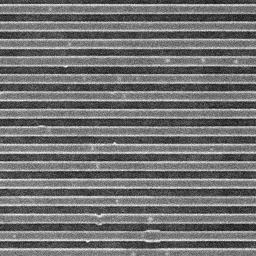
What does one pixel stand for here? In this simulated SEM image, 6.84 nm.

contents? parallel lines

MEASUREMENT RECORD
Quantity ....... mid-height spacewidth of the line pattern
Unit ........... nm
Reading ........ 53.9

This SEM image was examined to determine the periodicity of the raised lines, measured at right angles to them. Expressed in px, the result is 17.4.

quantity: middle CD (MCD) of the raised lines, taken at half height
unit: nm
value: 61.6